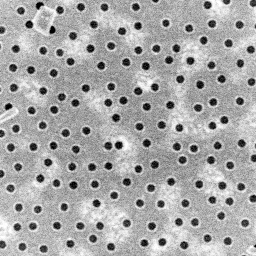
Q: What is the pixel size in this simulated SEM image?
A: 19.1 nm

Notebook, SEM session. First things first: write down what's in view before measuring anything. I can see a regular array of holes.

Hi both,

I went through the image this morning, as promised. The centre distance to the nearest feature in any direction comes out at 0.344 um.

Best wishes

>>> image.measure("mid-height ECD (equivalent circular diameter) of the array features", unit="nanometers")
170